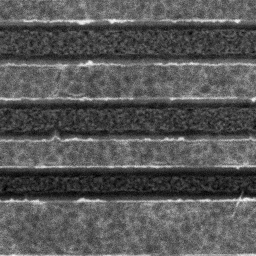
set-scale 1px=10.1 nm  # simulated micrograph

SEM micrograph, one or a few lines or trenches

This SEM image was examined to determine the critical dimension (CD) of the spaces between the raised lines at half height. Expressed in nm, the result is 378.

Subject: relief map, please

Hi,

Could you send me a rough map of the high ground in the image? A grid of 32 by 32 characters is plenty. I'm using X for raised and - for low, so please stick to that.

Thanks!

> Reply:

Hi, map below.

XXXXXXXXXXXXXXXXXXXXXXXXXXXXXXXX
XXXXXXXXXXXXXXXXXXXXXXXXXXXXXXXX
XXXXXXXXXXXXXXXXXXXXXXXXXXXXXXXX
--------------------------------
--------------------------------
--------------------------------
--------------------------------
--------------------------------
XXXXXXXXXXXXXXXXXXXXXXXXXXXXXXXX
XXXXXXXXXXXXXXXXXXXXXXXXXXXXXXXX
XXXXXXXXXXXXXXXXXXXXXXXXXXXXXXXX
XXXXXXXXXXXXXXXXXXXXXXXXXXXXXXXX
XXXXXXXXXXXXXXXXXXX-XXXX-------X
--------------------------------
--------------------------------
--------------------------------
--------------------------------
XXXXXXXXXXXXXXXXXXXXXXXXXXXXXXXX
XXXXXXXXXXXXXXXXXXXXXXXXXXXXXXXX
XXXXXXXXXXXXXXXXXXXXXXXXXXXXXXXX
XXXXXXXXXXXXXXXXXXXXXXXXXXXXXXXX
--------------------------------
--------------------------------
--------------------------------
--------------------------------
XXXXXXXXXXXXXXXXXXXXXXXXXXXXXXXX
XXXXXXXXXXXXXXXXXXXXXXXXXXXXXXXX
XXXXXXXXXXXXXXXXXXXXXXXXXXXXXXXX
XXXXXXXXXXXXXXXXXXXXXXXXXXXXXXXX
XXXXXXXXXXXXXXXXXXXXXXXXXXXXXXXX
XXXXXXXXXXXXXXXXXXXXXXXXXXXXXXXX
XXXXXXXXXXXXXXXXXXXXXXXXXXXXXXXX